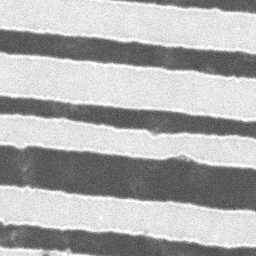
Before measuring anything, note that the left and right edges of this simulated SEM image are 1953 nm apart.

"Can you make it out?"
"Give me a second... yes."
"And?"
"one or a few lines or trenches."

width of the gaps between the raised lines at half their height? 252 nanometers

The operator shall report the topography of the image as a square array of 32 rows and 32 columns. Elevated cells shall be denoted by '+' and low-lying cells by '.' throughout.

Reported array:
.................+++++++++++++++
...........................+++++
................................
++..............................
+++++++++++++...................
+++++++++++++++++++++...........
++++++++++++++++++++++++++++++++
.......+++++++++++++++++++++++++
................++++++++++++++++
..........................++++++
................................
................................
++++++++........................
++++++++++++++++++++............
++++++++++++++++++++++++++++....
..........++++++++++++++++++++++
.................+++++++++++++++
...............................+
++++++++........................
++++++++++++++++++...+++........
+++.++++++++++++++++++++++++....
++++++++++++++++++++++++++++++++
++++++++++++++++++++++++++++++++
..++++++++++++++++++++++++++++++
.........+++++++++++++++++++++++
....................+.++++++++++
.............................+++
................................
+++++++++++.....................
++++++++++++++++++++............
+++++++++++++++++++++++++++.....
.....+++++++++++++++++++++++++++